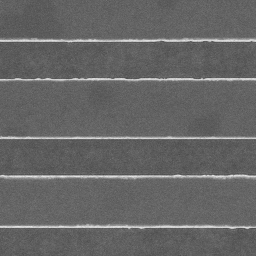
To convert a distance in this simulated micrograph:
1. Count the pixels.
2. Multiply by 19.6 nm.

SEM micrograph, lines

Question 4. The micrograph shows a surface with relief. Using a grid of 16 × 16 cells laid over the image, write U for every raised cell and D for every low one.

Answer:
UUUUUUUUUUUUUUUU
UUUUUUUUUUUUUUUU
UUUUUUUUUUUUUUUU
DDDDDDDDDDDDDDDD
DDDDDDDDDDDDDDDD
UUUUUUUUUUUUUUUU
UUUUUUUUUUUUUUUU
UUUUUUUUUUUUUUUU
UUUUUUUUUUUUUUUU
DDDDDDDDDDDDDDDD
DDDDDDDDDDDDDDDD
UUUUUUUUUUUUUUUU
UUUUUUUUUUUUUUUU
UUUUUUUUUUUUUUUU
DDDDDDDDDDDDDDDD
DDDDDDDDDDDDDDDD